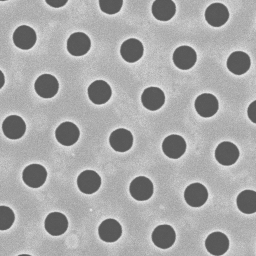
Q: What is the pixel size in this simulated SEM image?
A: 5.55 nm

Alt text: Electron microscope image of a regular array of holes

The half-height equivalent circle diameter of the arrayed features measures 136 nm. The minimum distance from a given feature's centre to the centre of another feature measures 291 nm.